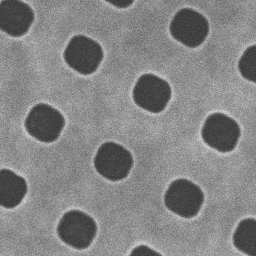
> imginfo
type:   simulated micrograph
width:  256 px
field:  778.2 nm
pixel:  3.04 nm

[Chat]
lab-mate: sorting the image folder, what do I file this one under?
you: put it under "a regular array of holes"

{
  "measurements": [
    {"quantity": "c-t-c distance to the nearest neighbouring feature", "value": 0.232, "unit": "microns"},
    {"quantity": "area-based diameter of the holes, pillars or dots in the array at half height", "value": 113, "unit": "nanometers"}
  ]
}